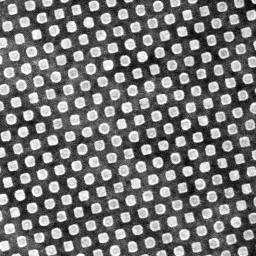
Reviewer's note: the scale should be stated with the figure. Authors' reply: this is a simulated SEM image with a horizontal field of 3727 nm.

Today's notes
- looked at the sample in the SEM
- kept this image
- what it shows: a regular array of raised bodies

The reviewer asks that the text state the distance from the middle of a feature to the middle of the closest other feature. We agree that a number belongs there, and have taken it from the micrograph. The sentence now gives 0.253 µm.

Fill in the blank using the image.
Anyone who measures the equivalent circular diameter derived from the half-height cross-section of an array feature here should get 0.142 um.